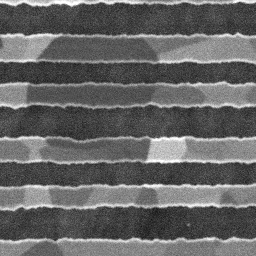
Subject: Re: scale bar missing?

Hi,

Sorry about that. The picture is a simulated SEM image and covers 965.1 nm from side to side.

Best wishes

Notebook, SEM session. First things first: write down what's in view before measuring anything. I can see lines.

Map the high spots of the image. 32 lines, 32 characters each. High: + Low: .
.+..++..++......................
................................
................................
................................
+++.++++++.++..+.+++.++.+++++++.
++++++++++++++++++++++++++++++++
++++++++++++++++++++++++++++++++
++++++++++++++++++++++++++++++++
................................
................................
..++......++++.....++......++...
++++++++++++++++++++++++++++++++
++++++++++++++++++++++++++++++++
...........+....................
................................
................................
................................
+++++++++..+++++++++++++++++++++
++++++++++++++++++++++++++++++++
++++++++++++++++++++++++++++++++
................................
................................
................................
++++++++++++++++++++++++++++++++
++++++++++++++++++++++++++++++++
++++++++++++++++++++++++++++++++
................................
................................
................................
................................
++++++++++++++++++++++++++++++++
++++++++++++++++++++++++++++++++